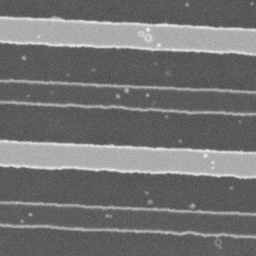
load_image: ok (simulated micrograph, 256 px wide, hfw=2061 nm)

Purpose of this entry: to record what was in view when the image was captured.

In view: lines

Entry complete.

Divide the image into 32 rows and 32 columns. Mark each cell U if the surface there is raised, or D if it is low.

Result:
DDDDDDDDDDDDDDDDDDDDDDDDDDDDDDDD
DDDDDDDDDDDDDDDDDDDDDDDDDDDDDDDD
UUUUUUUUDDDDDDDDDDDDDDDDDDDDDDDD
UUUUUUUUUUUUUUUUUUUUUUUUUUUUDDDD
UUUUUUUUUUUUUUUUUUUUUUUUUUUUUUUU
DDDDDUUUUUUUUUUUUUUUUUUUUUUUUUUU
DDDDDDDDDDDDDDDDDDDDDDDDDDUUUUUU
DDDDDDDDDDDDDDDDDDDDDDDDDDDDDDDD
DDDDDDDDDDDDDDDDDDDDDDDDDDDDDDDD
DDDDDDDDDDDDDDDDDDDDDDDDDDDDDDDD
UUUUUUUUUDDDDDDDDDDDDDDDDDDDDDDD
UUUUUUUUUUUUUUUUUUUUUUUUUUUUUUUD
UUUUUUUUUUUUUUUUUUUUUUUUUUUUUUUU
DDDDDDDDDDDDDDDUUUUUUUUUUUUUUUUU
DDDDDDDDDDDDDDDDDDDDDDDDDDDDDDDD
DDDDDDDDDDDDDDDDDDDDDDDDDDDDDDDD
DDDDDDDDDDDDDDDDDDDDDDDDDDDDDDDD
DDDDDDDDDDDDDDDDDDDDDDDDDDDDDDDD
UUUUUUUUUUUUUUUUUUUDDDDDDDDDDDDD
UUUUUUUUUUUUUUUUUUUUUUUUUUUUUUUU
UUUUUUUUUUUUUUUUUUUUUUUUUUUUUUUU
DDDDDDDDDDDDDDDUUUUUUUUUUUUUUUUU
DDDDDDDDDDDDDDDDDDDDDDDDDDDDDDDD
DDDDDDDDDDDDDDDDDDDDDDDDDDDDDDDD
DDDDDDDDDDDDDDDDDDDDDDDDDDDDDDDD
UUUUDDDDDDDDDDDDDDDDDDDDDDDDDDDD
UUUUUUUUUUUUUUUUUUUUUUUUUUDDDDDD
UUUUUUUUUUUUUUUUUUUUUUUUUUUUUUUU
DDDDDDDDUUUUUUUUUUUUUUUUUUUUUUUU
DDDDDDDDDDDDDDDDDDDDDDDDDDDDDUUU
DDDDDDDDDDDDDDDDDDDDDDDDDDDDDDDD
DDDDDDDDDDDDDDDDDDDDDDDDDDDDDDDD